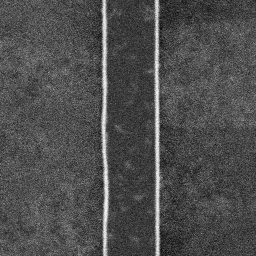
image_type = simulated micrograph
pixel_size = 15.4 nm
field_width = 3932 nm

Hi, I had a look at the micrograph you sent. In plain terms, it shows one or a few lines or trenches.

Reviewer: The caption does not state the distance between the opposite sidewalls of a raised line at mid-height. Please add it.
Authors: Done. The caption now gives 799 nanometers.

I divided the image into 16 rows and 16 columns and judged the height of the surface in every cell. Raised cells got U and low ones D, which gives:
DDDDDDDUUUDDDDDD
DDDDDDDUUUDDDDDD
DDDDDDDUUUDDDDDD
DDDDDDDUUUDDDDDD
DDDDDDDUUUDDDDDD
DDDDDDDUUUDDDDDD
DDDDDDDUUUDDDDDD
DDDDDDUUUUDDDDDD
DDDDDDUUUUDDDDDD
DDDDDDDUUUDDDDDD
DDDDDDDUUUDDDDDD
DDDDDDDUUUDDDDDD
DDDDDDDUUUDDDDDD
DDDDDDDUUUDDDDDD
DDDDDDDUUUDDDDDD
DDDDDDDUUUDDDDDD